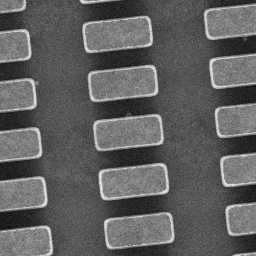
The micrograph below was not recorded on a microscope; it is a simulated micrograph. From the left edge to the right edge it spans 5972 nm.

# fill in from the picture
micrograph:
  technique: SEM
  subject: groups of lines, slits or small figures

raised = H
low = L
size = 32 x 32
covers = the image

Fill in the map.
HHHLLLLLLLLLLLLLLLLLLLLLLLLLLLLL
HLLLLLLLLLLLLLLLLLLLLLLLLLHHHHHH
LLLLLLLLLLLLLLHHHHHLLLLLLLHHHHHH
LLLLLLLLLLLHHHHHHHHLLLLLLLHHHHHH
HHHHLLLLLLLHHHHHHHHLLLLLLLHHHHLL
HHHHLLLLLLLHHHHHHHHLLLLLLLLLLLLL
HHHHLLLLLLLLLLLLLLLLLLLLLLLLLLLL
HHHLLLLLLLLLLLLLLLLLLLLLLLLHHHHH
LLLLLLLLLLLLLLLLHHHLLLLLLLHHHHHH
LLLLLLLLLLLHHHHHHHHLLLLLLLHHHHHH
HHHHLLLLLLLHHHHHHHHHLLLLLLLHHHHH
HHHHLLLLLLLHHHHHHHHLLLLLLLLLLLLL
HHHHLLLLLLLLHHLLLLLLLLLLLLLLLLLL
HHHHLLLLLLLLLLLLLLLLLLLLLLLLHHHH
LLLLLLLLLLLLLLLLLHHHLLLLLLLHHHHH
LLLLLLLLLLLLHHHHHHHHLLLLLLLHHHHH
HHHHHLLLLLLLHHHHHHHHLLLLLLLHHHHH
HHHHHLLLLLLLHHHHHHHHLLLLLLLLLLLL
HHHHHLLLLLLLHHHLLLLLLLLLLLLLLLLL
HHHHHLLLLLLLLLLLLLLLLLLLLLLLLHHH
LLLLLLLLLLLLLLLLLLLLLLLLLLLLHHHH
LLLLLLLLLLLLLHHHHHHHHLLLLLLLHHHH
LHHHHLLLLLLLLHHHHHHHHLLLLLLLHHHH
HHHHHHLLLLLLLHHHHHHHHLLLLLLLLLLL
HHHHHHLLLLLLLHHHHLLLLLLLLLLLLLLL
HHHHHHLLLLLLLLLLLLLLLLLLLLLLLLLH
LLLLLLLLLLLLLLLLLLLLLLLLLLLLHHHH
LLLLLLLLLLLLLLHHHHHHHLLLLLLLHHHH
LLLHHHLLLLLLLHHHHHHHHHLLLLLLLHHH
HHHHHHLLLLLLLHHHHHHHHHLLLLLLLLLL
HHHHHHLLLLLLLHHHHHHHLLLLLLLLLLLL
HHHHHHLLLLLLLLLLLLLLLLLLLLLLLLLL